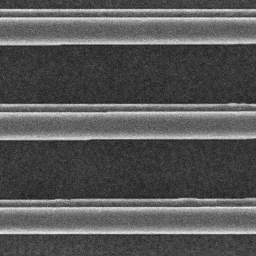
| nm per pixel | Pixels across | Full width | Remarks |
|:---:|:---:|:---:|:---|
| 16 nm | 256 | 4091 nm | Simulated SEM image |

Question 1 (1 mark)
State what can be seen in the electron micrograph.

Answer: lines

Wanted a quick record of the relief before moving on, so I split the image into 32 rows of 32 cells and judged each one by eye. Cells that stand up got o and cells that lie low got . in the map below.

................................
oooooooooooooooooooooooooooooooo
oooooooooooooooooooooooooooooooo
oooooooooooooooooooooooooooooooo
oooooooooooooooooooooooooooooooo
................................
................................
................................
................................
................................
................................
................................
................................
oooooooooooooooooooooooooooooooo
oooooooooooooooooooooooooooooooo
oooooooooooooooooooooooooooooooo
oooooooooooooooooooooooooooooooo
................................
................................
................................
................................
................................
................................
................................
................................
oooooooooooooooooooooooooooooooo
oooooooooooooooooooooooooooooooo
oooooooooooooooooooooooooooooooo
oooooooooooooooooooooooooooooooo
................................
................................
................................